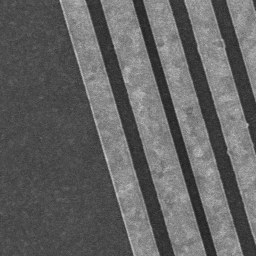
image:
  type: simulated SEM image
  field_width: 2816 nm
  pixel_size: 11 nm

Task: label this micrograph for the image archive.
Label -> parallel lines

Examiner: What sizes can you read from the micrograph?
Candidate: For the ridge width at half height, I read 256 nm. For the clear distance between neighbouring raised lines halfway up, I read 174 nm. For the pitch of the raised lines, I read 440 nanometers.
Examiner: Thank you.